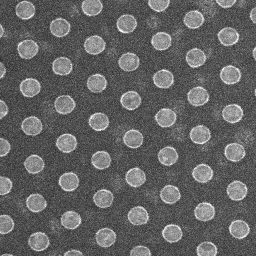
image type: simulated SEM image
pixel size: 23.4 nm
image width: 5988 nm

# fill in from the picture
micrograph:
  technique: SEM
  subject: a regular array of raised bodies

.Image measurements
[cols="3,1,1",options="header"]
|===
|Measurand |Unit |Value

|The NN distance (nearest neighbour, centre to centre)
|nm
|897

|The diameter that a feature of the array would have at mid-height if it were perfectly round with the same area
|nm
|428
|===